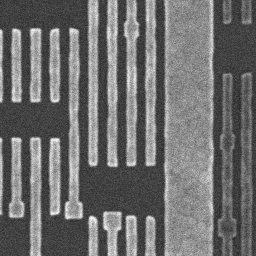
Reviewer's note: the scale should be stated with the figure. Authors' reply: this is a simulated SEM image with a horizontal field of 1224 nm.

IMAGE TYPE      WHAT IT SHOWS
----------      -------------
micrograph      wiring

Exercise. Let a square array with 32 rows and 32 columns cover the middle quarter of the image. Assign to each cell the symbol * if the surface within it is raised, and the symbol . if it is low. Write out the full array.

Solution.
.***..**...**...**...**..*******
.***..**...**...**...**..*******
.***..**...**...**...**..*******
.***..**...**...**...**..*******
.***..**...**...**...**..*******
.***..**...**...**...**..*******
.***..**...**...**...**..*******
.***..**...**...**...**...******
.***..**...**...**...**...******
.***..**...**...**...**...******
.***..**...**...**...**...******
..*...**...**...**...*...*******
..*...**...**...**...*...*******
..*...**...**...**...**..*******
..*...**...**...**...**...******
..*...**...**...**...**..*******
..*...**...**...**...**..*******
.***..**...**...**...**..*******
.***..**...**...**...**..*******
.***..**...**...**...**..*******
.***..**...**...**...**..*******
.***..**...**...**...**..*******
.***..**...**...**...**..*******
.***..**...**...**...**..*******
.***..**...**...**...**..*******
..**.......**............*******
..**.....................*******
..*......................*******
..*.......................******
.**.......................******
.***......................******
.***.....................*******